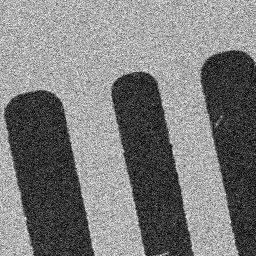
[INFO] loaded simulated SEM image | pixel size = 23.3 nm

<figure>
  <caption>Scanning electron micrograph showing one or a few lines or trenches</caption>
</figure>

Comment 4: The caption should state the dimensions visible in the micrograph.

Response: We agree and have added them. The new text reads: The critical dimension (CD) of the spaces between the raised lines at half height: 1150 nm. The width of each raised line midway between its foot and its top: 1030 nm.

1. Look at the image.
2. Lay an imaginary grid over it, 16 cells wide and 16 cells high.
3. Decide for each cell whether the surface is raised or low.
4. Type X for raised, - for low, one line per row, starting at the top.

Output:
XXXXXXXXXXXXXXXX
XXXXXXXXXXXXXXXX
XXXXXXXXXXXXXXXX
XXXXXXXXXXXXX---
XXXXXXXXXXXXX---
XXXXXXX---XXX---
----XXX---XXX---
----XXX---XXX---
----XXX----XX---
X----XXX---XX---
X----XXX---XXX--
X----XXX---XXX--
X----XXX---XXX--
XX---XXXX---XX--
XX----XXX---XXX-
XX----XXX---XXX-